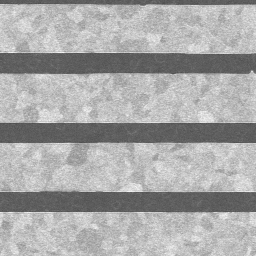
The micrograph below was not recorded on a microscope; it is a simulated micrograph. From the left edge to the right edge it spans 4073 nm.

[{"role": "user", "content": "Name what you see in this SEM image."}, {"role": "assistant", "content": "one or a few lines or trenches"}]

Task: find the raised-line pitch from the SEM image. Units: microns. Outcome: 1.1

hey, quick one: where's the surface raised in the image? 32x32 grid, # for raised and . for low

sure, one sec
................................
################################
################################
################################
################################
################################
##########..####################
................................
................................
################################
################################
################################
################################
################################
################################
................................
................................
................................
################################
################################
################################
################################
################################
################################
................................
................................
................................
################################
################################
################################
################################
################################